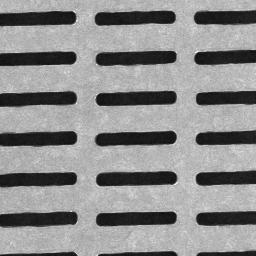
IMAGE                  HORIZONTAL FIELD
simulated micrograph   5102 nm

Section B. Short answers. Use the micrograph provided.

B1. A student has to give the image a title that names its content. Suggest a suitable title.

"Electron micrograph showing holes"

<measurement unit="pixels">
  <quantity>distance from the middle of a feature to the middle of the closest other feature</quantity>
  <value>40.1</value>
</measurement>